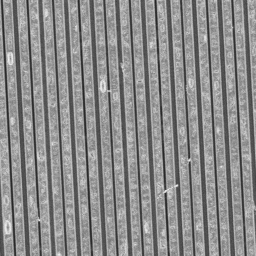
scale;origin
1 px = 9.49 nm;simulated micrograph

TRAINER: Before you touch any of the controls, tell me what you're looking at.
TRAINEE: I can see parallel lines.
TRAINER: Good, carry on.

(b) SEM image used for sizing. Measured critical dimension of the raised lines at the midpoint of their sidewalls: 87.6 nm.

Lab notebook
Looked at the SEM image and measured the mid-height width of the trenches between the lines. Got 40.3 nm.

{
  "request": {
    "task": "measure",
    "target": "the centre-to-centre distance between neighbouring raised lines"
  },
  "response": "121 nm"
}